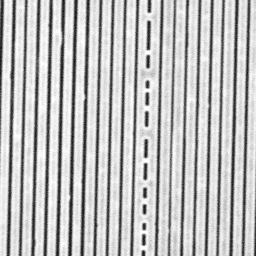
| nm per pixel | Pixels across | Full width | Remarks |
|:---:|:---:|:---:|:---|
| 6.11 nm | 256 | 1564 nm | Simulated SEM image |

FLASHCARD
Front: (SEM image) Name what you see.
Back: parallel lines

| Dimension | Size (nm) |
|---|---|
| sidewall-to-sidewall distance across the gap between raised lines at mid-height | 21.4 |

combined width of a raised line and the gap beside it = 75.4 nm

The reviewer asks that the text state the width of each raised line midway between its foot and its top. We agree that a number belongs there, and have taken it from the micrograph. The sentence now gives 53.4 nanometers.